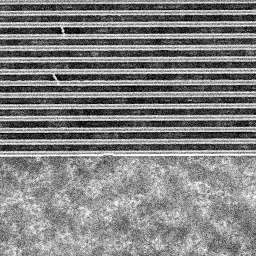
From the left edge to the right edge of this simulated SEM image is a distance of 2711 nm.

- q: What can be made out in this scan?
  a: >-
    parallel lines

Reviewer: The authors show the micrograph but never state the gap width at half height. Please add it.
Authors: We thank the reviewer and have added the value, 0.0807 µm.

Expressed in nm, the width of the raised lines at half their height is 45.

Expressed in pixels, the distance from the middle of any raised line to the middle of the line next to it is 11.7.